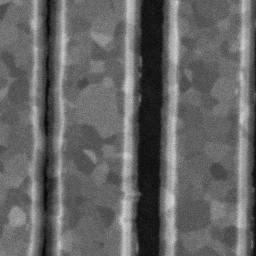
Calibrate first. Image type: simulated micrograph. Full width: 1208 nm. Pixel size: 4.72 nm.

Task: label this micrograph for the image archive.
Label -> one or a few lines or trenches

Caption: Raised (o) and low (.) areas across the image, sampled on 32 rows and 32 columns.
ooooo...oooooooo......ooooooooo.
ooooo...oooooooo......ooooooooo.
ooooo...oooooooo......ooooooooo.
ooooo...oooooooo......ooooooooo.
ooooo...oooooooo......ooooooooo.
ooooo...oooooooo......ooooooooo.
ooooo..ooooooooo......ooooooooo.
ooooo...oooooooo......ooooooooo.
ooooo..ooooooooo......ooooooooo.
ooooo..ooooooooo......ooooooooo.
ooooo..ooooooooo......ooooooooo.
ooooo..ooooooooo......ooooooooo.
ooooo..ooooooooo......ooooooooo.
ooooo..ooooooooo......oooooooo..
ooooo..ooooooooo......oooooooo..
ooooo..ooooooooo.....ooooooooo..
ooooo..ooooooooo.....ooooooooo..
ooooo..ooooooooo......oooooooo..
ooooo..ooooooooo.....ooooooooo..
ooooo..ooooooooo.....ooooooooo..
ooooo..ooooooooo.....ooooooooo..
oooo...ooooooooo.....ooooooooo..
oooo...ooooooooo.....ooooooooo..
ooooo..ooooooooo.....ooooooooo..
ooooo..ooooooooo.....ooooooooo..
oooo...ooooooooo.....ooooooooo..
ooooo..ooooooooo.....ooooooooo..
ooooo..ooooooooo.....ooooooooo..
ooooo..ooooooooo.....ooooooooo..
oooo...ooooooooo.....ooooooooo..
oooo...ooooooooo.....ooooooooo..
oooo...ooooooooo.....ooooooooo..